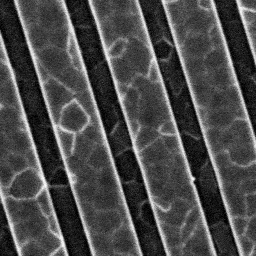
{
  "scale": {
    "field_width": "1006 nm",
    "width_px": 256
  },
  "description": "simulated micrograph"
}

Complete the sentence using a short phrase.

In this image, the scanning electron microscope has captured one or a few lines or trenches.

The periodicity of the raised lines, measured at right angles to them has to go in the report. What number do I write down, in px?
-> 70.8